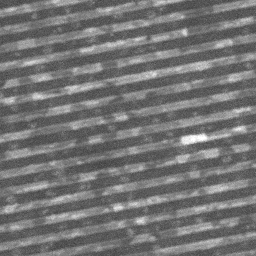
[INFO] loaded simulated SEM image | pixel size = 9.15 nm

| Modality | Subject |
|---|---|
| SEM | parallel lines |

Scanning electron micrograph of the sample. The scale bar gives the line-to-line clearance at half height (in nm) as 101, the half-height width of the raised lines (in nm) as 59.6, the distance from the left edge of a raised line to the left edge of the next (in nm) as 162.